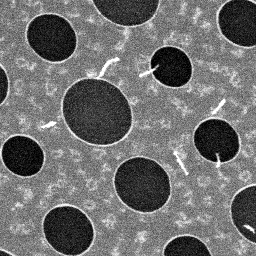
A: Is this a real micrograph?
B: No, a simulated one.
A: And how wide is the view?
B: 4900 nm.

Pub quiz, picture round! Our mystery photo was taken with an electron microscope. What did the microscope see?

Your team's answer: holes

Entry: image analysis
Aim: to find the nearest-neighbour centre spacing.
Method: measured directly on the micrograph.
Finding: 1650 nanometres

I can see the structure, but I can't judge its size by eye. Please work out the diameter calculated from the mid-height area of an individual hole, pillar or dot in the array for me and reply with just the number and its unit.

895 nanometers